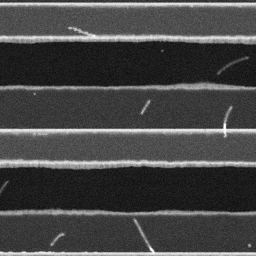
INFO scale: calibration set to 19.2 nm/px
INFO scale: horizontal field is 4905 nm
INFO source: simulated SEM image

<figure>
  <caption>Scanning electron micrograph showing lines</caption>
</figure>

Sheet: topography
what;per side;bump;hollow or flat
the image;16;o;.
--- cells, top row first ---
oooooooooooooooo
oooooooooooooooo
................
................
................
................
oooooooooooooooo
oooooooooooooooo
oooooooooooooooo
oooooooooooooooo
................
................
................
oooooooooooooooo
oooooooooooooooo
oooooooooooooooo